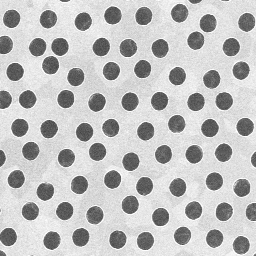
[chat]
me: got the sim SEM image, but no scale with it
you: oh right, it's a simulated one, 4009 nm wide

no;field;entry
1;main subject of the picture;a regular array of holes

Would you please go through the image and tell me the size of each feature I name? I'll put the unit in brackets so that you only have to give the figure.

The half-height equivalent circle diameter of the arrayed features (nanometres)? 289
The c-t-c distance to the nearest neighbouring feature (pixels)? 27.5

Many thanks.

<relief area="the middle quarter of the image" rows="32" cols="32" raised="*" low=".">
**********....****....**********
*....*****....***.....*****...**
*....*****....****....****.....*
*....*****...******.******.....*
*....**********************...**
**.*****************************
.*******************************
..*****...*****...*****..*******
...***....****.....***....*****.
...***.....***.....***....*****.
..****....*****....***....*****.
*******...*****...*****..*******
********************************
***************************...**
**********....******.*****....**
***....**.....*****...****....**
***....**.....****.....***....**
***....***....****.....*********
***....************...**********
*****.**************************
*******...**************..*****.
..****.....************....****.
...***.....****...*****....***..
...****...*****....****....***..
...***********.....*****..*****.
..*************....*************
************.**...**************
**********....******************
**...*****.....****..*******.***
**....****....****....*****...**
**....****....****....****.....*
**....************....****.....*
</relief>